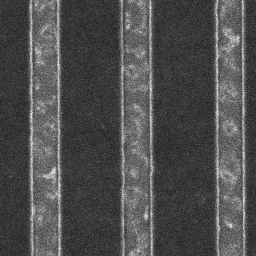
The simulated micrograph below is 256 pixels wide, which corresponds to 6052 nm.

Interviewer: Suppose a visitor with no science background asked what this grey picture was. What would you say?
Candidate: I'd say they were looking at one or a few lines or trenches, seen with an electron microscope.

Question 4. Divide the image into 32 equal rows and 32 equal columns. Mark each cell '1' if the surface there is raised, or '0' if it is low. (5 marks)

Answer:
11110001111111100001111111100011
11110001111111100001111111100011
11110001111111100001111111100011
11110001111111100001111111100011
11110001111111100001111111100011
11110001111111100001111111100011
11110001111111100001111111100011
11110001111111100001111111100011
11110001111111100001111111100011
11110001111111100001111111100011
11110001111111100001111111100011
11110001111111100001111111100011
11110001111111100001111111100011
11110001111111100001111111100011
11110001111111100001111111100011
11110001111111100001111111100011
11110001111111100001111111100011
11110001111111100001111111100011
11110001111111100001111111100011
11110001111111100001111111100011
11110001111111100001111111100011
11110001111111100001111111100001
11110001111111100001111111100001
11110001111111100001111111100001
11110001111111100001111111100001
11110001111111100001111111100001
11110001111111100001111111100011
11110001111111100001111111100011
11110001111111100001111111100011
11110001111111100001111111100001
11110001111111110001111111100011
11110001111111100001111111100011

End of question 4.